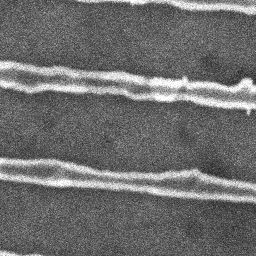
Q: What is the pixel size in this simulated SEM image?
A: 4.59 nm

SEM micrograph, one or a few lines or trenches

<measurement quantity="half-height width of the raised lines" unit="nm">73.7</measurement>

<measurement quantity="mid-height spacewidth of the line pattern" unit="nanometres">358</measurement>